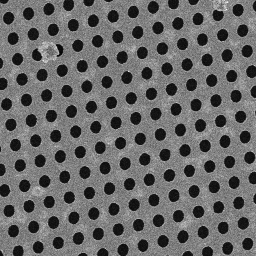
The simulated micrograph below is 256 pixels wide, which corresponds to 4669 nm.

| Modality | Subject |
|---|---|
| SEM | a regular array of holes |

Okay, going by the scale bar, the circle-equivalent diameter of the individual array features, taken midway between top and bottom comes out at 219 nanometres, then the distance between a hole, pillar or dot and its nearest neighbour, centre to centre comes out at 372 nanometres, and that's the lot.